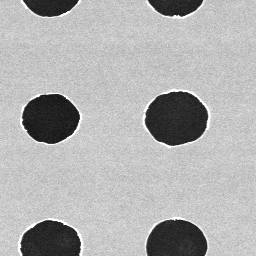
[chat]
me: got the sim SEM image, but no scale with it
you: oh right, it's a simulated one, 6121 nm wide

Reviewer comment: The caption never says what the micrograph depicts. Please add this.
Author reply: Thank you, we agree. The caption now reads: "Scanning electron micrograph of holes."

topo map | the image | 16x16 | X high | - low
XX--XXXXXX--XXXX
XXXXXXXXXXXXXXXX
XXXXXXXXXXXXXXXX
XXXXXXXXXXXXXXXX
XXXXXXXXXXXXXXXX
XXXXXXXXXXXXXXXX
XX---XXXX----XXX
X----XXXX----XXX
XX--XXXXXX---XXX
XXXXXXXXXXXXXXXX
XXXXXXXXXXXXXXXX
XXXXXXXXXXXXXXXX
XXXXXXXXXXXXXXXX
XXXXXXXXXXXXXXXX
XX---XXXX----XXX
X----XXXX----XXX